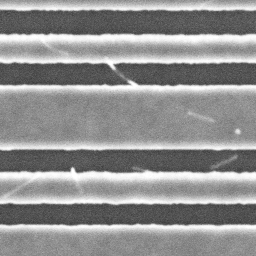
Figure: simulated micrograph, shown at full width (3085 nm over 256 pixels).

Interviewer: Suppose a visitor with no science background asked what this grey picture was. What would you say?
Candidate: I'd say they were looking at lines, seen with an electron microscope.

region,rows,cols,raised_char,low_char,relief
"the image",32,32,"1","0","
11111111111111111111111111111111
00000000000000000000000000000000
00000000000000000000000000000000
00000000000000000000000000000000
11111111100001111111000001001001
11111111111111111111111111111111
11111111111111111111111111111111
11111111111111111111111111111111
00000000000000000000000000000000
00000000000000000000000000000000
00000000000000000000000000000000
11111111111111111111111111111111
11111111111111111111111111111111
11111111111111111111111111111111
11111111111111111111111111111111
11111111111111111111111111111111
11111111111111111111111111111111
11111111111111111111111111111111
11111111111111111111111111111111
00000000000000000000000000000000
00000000000000000000000000000000
00000000000000000000000000000000
11111111111111111111111111111111
11111111111111111111111111111111
11111111111111111111111111111111
00000000000000000000000000000000
00000000000000000000000000000000
00000000000000000000000000000000
11111111111111111111111111111111
11111111111111111111111111111111
11111111111111111111111111111111
11111111111111111111111111111111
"